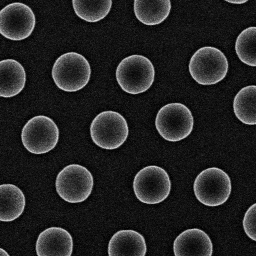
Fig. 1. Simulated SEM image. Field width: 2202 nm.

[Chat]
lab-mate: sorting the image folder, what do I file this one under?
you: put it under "a regular array of raised bodies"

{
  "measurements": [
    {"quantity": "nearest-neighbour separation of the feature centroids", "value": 528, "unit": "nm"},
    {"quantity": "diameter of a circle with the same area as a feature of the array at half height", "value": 318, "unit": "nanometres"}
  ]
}